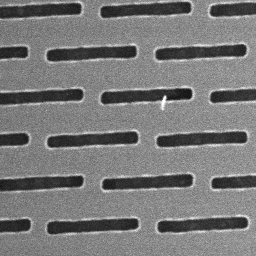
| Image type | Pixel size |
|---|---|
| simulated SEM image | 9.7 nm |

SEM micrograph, a regular array of holes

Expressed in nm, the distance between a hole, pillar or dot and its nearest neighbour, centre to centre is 669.